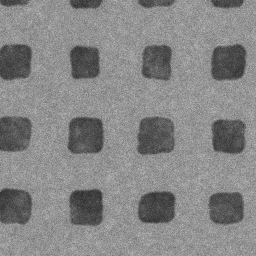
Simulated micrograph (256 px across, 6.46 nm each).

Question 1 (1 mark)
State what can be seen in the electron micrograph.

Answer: a regular array of holes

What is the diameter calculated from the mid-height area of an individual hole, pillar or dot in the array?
240 nanometres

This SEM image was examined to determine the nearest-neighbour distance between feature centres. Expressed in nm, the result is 456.